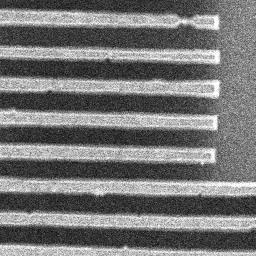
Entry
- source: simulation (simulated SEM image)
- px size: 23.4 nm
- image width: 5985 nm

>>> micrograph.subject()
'parallel lines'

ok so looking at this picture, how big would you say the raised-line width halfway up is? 272 nm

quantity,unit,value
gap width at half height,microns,0.503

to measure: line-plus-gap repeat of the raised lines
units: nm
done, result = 784